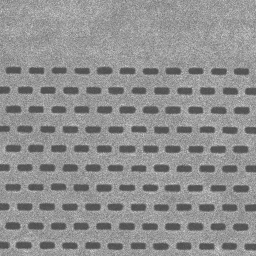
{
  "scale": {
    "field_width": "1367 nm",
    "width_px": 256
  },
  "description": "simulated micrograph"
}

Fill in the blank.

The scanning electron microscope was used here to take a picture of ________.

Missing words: a regular array of holes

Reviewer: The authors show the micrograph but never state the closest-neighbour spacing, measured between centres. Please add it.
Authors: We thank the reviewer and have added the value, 0.119 µm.